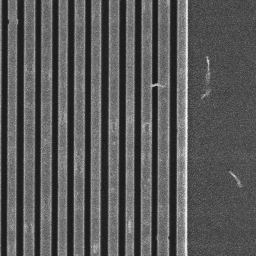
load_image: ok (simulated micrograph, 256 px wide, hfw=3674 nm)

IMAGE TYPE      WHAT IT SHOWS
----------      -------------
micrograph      parallel lines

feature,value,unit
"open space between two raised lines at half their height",84.3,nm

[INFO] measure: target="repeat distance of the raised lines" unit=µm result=0.243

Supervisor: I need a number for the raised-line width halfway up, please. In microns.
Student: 0.152